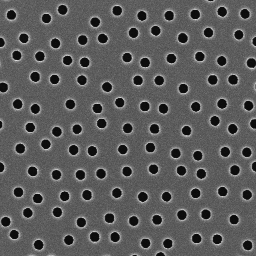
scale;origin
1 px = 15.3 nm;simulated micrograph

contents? a regular array of holes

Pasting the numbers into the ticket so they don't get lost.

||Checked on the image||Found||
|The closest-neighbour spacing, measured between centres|0.31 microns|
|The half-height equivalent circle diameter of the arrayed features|151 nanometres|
